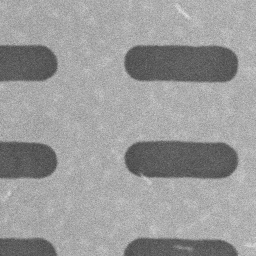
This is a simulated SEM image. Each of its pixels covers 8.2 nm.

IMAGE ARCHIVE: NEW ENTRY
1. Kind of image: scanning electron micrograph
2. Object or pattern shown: holes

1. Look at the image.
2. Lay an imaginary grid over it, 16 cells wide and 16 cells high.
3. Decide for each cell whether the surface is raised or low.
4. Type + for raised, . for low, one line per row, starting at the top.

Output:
++++++++++++++++
++++++++++++++++
++++++++++++++++
...+++++.......+
...+++++.......+
++++++++++++++++
++++++++++++++++
++++++++++++++++
++++++++++++++++
...+++++.......+
...+++++.......+
++++++++++++++++
++++++++++++++++
++++++++++++++++
++++++++++++++++
...+++++.......+